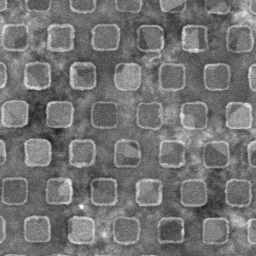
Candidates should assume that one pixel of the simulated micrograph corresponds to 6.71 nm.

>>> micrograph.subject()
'a regular array of raised bodies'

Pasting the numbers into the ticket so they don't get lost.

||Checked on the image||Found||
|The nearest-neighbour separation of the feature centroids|294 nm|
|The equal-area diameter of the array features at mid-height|187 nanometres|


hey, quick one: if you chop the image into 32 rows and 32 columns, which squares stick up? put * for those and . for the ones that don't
*..***...***..****..***...***..*
................*.........**...*
................................
.**...***...***..***...***...**.
****..***...***..***...***..***.
****..***...***..***...***..***.
................................
................................
*..***...***..***...***...***..*
*..***...***..***...***...***..*
*..***...***..***...***...***..*
................................
................................
***...***...***..***...***..***.
***...***..****..***...***..***.
***...***...**...***...***..***.
................................
....*...........................
*..***...***..***...***...***..*
*..***...***..***...***..****..*
....**...**...***...***...**...*
................................
.**...***...**...............*..
***...***..****..***...***..***.
***...***..****..***...***..***.
.**..............***...**....**.
................................
...***...**...***...***...**...*
...***...***..***...***..***...*
*..***...***..***...***..***...*
..........................*.....
................................